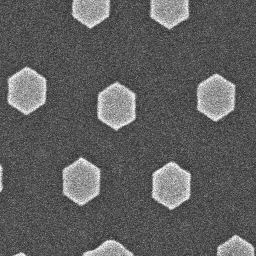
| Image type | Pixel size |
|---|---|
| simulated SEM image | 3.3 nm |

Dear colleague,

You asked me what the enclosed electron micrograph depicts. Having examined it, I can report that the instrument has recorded raised bodies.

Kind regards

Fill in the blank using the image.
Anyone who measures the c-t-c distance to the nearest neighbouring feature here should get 299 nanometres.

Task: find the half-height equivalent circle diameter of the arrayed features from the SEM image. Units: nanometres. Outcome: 134